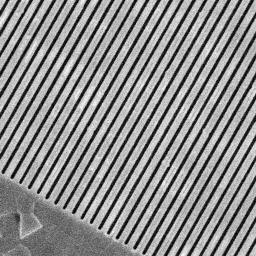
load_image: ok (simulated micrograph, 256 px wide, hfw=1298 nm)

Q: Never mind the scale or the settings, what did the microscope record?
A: parallel lines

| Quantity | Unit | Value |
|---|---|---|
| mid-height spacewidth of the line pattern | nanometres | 17.6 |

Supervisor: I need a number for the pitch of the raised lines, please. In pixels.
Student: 10.1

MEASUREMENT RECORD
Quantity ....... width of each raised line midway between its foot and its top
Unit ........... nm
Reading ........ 35.2